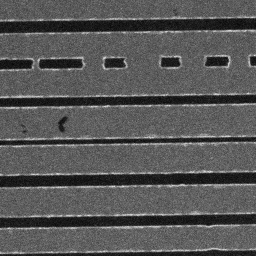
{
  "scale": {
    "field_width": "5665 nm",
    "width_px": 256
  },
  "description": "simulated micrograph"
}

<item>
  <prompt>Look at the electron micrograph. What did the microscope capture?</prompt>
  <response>parallel lines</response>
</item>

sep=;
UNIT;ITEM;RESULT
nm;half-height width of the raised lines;661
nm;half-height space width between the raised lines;235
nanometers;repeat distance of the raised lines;856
